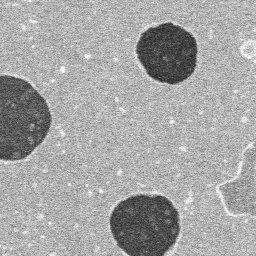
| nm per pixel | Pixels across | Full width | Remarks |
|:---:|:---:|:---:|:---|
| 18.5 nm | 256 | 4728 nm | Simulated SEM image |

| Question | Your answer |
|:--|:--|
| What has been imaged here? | holes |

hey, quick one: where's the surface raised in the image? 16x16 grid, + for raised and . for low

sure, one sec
++++++++++++++++
++++++++++.+++++
+++++++++...++++
+++++++++...++++
+++++++++...++++
..++++++++++++++
...+++++++++++++
...+++++++++++++
...+++++++++++++
..++++++++++++++
++++++++++++++++
++++++++++++++++
++++++++..++++++
+++++++....+++++
+++++++....+++++
++++++++...+++++